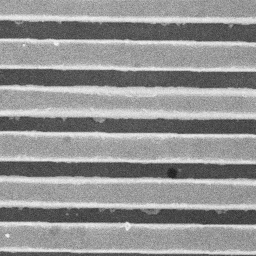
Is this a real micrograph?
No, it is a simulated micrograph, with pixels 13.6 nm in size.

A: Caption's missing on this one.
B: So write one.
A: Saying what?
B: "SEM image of lines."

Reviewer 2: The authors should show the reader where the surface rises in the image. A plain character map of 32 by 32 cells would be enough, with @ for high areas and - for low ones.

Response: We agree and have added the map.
@@@@@@@@@@@@@@@@@@@@@@@@@@@@@@@@
@@@@@@@@@@@@@@@@@@@@@@@@@@@@@@@@
----------@@@@@@@@@@@@@@@@@@@@@@
--------------------------------
--------------------------------
@@@@@@@@@@@@@@@@@@@@@@@@@@@@@@@@
@@@@@@@@@@@@@@@@@@@@@@@@@@@@@@@@
@@@@@@@@@@@@@@@@@@@@@@@@@@@@@@@@
@@@@@@@@@@@@@@@@@@@@@@@@@@@@@@@@
--------------------------------
--------------------------------
@@@@@@@@@@@@@@@@@@@@@@@@@@@@@@@@
@@@@@@@@@@@@@@@@@@@@@@@@@@@@@@@@
@@@@@@@@@@@@@@@@@@@@@@@@@@@@@@@@
--------------------@@@@@@@@@@@@
--------------------------------
@@@@----------------------------
@@@@@@@@@@@@@@@@@@@@@@@@@@@@@@@@
@@@@@@@@@@@@@@@@@@@@@@@@@@@@@@@@
@@@@@@@@@@@@@@@@@@@@@@@@@@@@@@@@
--------------------------------
--------------------------------
@@@@@@@@@@@@@@@@@@@@@@@@@-------
@@@@@@@@@@@@@@@@@@@@@@@@@@@@@@@@
@@@@@@@@@@@@@@@@@@@@@@@@@@@@@@@@
@@@@@@@@@@@@@@@@@@@@@@@@@@@@@@@@
--------------------------------
--------------------------------
@@@@@@@@@@@@@@@@@@@@@@@@@@@@@@@@
@@@@@@@@@@@@@@@@@@@@@@@@@@@@@@@@
@@@@@@@@@@@@@@@@@@@@@@@@@@@@@@@@
----------@@@@@@@@@@@@@@@@@@@@@@